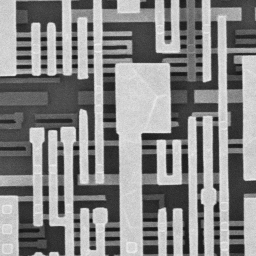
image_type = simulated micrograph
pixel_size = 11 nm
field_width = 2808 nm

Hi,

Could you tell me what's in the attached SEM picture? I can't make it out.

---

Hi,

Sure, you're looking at wiring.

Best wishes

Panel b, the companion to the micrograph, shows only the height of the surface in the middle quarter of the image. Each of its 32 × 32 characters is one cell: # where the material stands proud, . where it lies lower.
##..##..##...#############.....#
##..##..##...#############.....#
##..##..##...#############.....#
....##..##...#############.....#
........##...#############......
........##...#############......
........##...#############......
........##...#############......
........##...##############.....
........##...##############.....
........##...##############.....
....#...##...##############.....
....##..##...##############.....
....##..##...##############....#
....##..##...##############....#
....##..##...##############....#
###.##..##...##############....#
###.##..##....#####............#
###.##..##....#####............#
###.##..##....#####....##..##..#
##..##..##....#####....##..##..#
##..##..##....#####....##..##..#
##..##..##....#####....##..##..#
##..##..##....#####....##..##..#
##..##..##....#####....##..##..#
##..##..##....#####....##..##..#
##..##..##....#####....###.##..#
##..##..##....#####....###.##..#
##..##..##....#####.....#####..#
##..##..##....#####.....#####..#
##............#####............#
##............#####............#